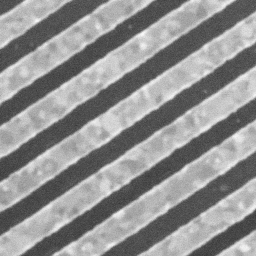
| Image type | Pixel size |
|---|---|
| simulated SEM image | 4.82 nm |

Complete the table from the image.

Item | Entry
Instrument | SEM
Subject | lines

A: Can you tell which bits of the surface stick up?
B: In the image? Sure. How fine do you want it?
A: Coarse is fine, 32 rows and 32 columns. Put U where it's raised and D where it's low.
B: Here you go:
DDDUUUUUDDDDDUUUUUUDDDDUUUUUUDDD
DUUUUUUDDDDDUUUUUDDDDUUUUUUDDDDD
UUUUUDDDDDUUUUUUDDDDUUUUUUDDDDUU
UUUUDDDDDUUUUUDDDDUUUUUUDDDDDUUU
UUUDDDDUUUUUUDDDDUUUUUUDDDDDUUUU
UDDDDUUUUUUDDDDUUUUUUDDDDDUUUUUU
DDDDUUUUUUDDDDUUUUUUDDDDUUUUUUDD
DDDUUUUUDDDDDUUUUUDDDDDUUUUUUDDD
DUUUUUUDDDDUUUUUUDDDDUUUUUUDDDDD
UUUUUDDDDDUUUUUDDDDDUUUUUUDDDDUU
UUUUDDDDUUUUUUDDDDUUUUUUDDDDDUUU
UUDDDDUUUUUUDDDDDUUUUUDDDDDUUUUU
UDDDDUUUUUUDDDDUUUUUUDDDDDUUUUUD
DDDUUUUUUDDDDDUUUUUUDDDDUUUUUUDD
DDUUUUUUDDDDUUUUUUDDDDDUUUUUDDDD
UUUUUUDDDDDUUUUUUDDDDUUUUUUDDDDU
UUUUUDDDDDUUUUUDDDDDUUUUUDDDDDUU
UUUUDDDDUUUUUUDDDDUUUUUUDDDDUUUU
UUDDDDUUUUUUDDDDDUUUUUDDDDDUUUUU
DDDDDUUUUUUDDDDUUUUUUDDDDUUUUUUD
DDDDUUUUUDDDDDUUUUUDDDDDUUUUUDDD
DDUUUUUUDDDDUUUUUUDDDDUUUUUUDDDD
UUUUUUDDDDDUUUUUDDDDDUUUUUDDDDDU
UUUUUDDDDUUUUUUDDDDUUUUUUDDDDDUU
UUUDDDDDUUUUUDDDDDUUUUUUDDDDDUUU
UUDDDDUUUUUUDDDDUUUUUUDDDDDUUUUU
DDDDDUUUUUUDDDDUUUUUUDDDDDUUUUUU
DDDUUUUUUDDDDUUUUUUDDDDDUUUUUUDD
DUUUUUUDDDDDUUUUUUDDDDUUUUUUDDDD
UUUUUUDDDDUUUUUUDDDDDUUUUUUDDDDU
UUUUDDDDDUUUUUUDDDDDUUUUUDDDDUUU
UUUDDDDUUUUUUDDDDDUUUUUUDDDDUUUU